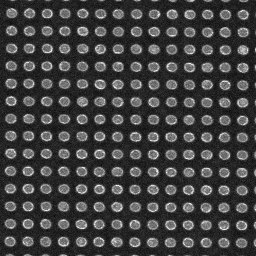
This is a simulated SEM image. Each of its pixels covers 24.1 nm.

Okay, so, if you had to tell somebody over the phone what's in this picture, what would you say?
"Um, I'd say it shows a regular array of raised bodies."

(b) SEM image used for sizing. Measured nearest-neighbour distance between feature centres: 417 nanometres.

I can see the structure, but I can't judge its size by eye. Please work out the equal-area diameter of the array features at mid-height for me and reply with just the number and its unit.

254 nanometres